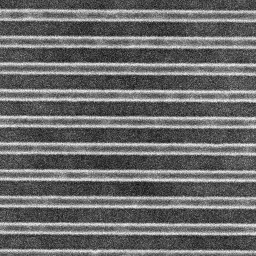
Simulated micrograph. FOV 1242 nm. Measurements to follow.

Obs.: parallel lines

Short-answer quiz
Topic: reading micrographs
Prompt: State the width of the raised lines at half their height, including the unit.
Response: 51.5 nm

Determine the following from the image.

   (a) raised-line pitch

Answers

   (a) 0.129 microns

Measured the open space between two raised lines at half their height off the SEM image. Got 79.4 nanometres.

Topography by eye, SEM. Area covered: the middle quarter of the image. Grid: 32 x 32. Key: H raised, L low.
HHHHHHHHHHHHHHHHHHHHHHHHHHHHHHHH
HHHHHHHHHHHHHHHHHHHHHHHHHHHHHHHH
LLLLLLLLLLLLLLLLLLLLLLLLLLLLLLLL
LLLLLLLLLLLLLLLLLLLLLLLLLLLLLLLL
LLLLLLLLLLLLLLLLLLLLLLLLLLLLLLLL
LLLLLLLLLLLLLLLLLLLLLLLLLLLLLLLL
LLLLLLLLLLLLLLLLLLLLLLLLLLLLLLLL
HHHHHHHHHHHHHHHHHHHHHHHHHHHHHHHH
HHHHHHHHHHHHHHHHHHHHHHHHHHHHHHHH
LLLLLLLLLLLLLLLLLLLLLLLLLLLLLLLL
LLLLLLLLLLLLLLLLLLLLLLLLLLLLLLLL
LLLLLLLLLLLLLLLLLLLLLLLLLLLLLLLL
LLLLLLLLLLLLLLLLLLLLLLLLLLLLLLLL
HHHHHHHHHHHHHHLHHHHLLLLHLHLLLLLL
HHHHHHHHHHHHHHHHHHHHHHHHHHHHHHHH
HHHHHHHHHHHHHHHHHHHHHHHHHHHHHHHH
LLLLLLLLLLLLLLLLLLLLLLLLLLLLLLLL
LLLLLLLLLLLLLLLLLLLLLLLLLLLLLLLL
LLLLLLLLLLLLLLLLLLLLLLLLLLLLLLLL
LLLLLLLLLLLLLLLLLLLLLLLLLLLLLLLL
HHHHHHHHHHHHHHHHHHHHHHHHHHHHHHHH
HHHHHHHHHHHHHHHHHHHHHHHHHHHHHHHH
LLLLLLLLLLLLLLLLLLLLLLLLLLLHHHHH
LLLLLLLLLLLLLLLLLLLLLLLLLLLLLLLL
LLLLLLLLLLLLLLLLLLLLLLLLLLLLLLLL
LLLLLLLLLLLLLLLLLLLLLLLLLLLLLLLL
LLLLLLLLLLLLLLLLLLLLLLLLLLLLLLLL
HHHHHHHHHHHHHHHHHHHHHHHHHHHHHHHH
HHHHHHHHHHHHHHHHHHHHHHHHHHHHHHHH
LLLLLLLLLLLLLLLLLLLLLLLLLLLLLLLL
LLLLLLLLLLLLLLLLLLLLLLLLLLLLLLLL
LLLLLLLLLLLLLLLLLLLLLLLLLLLLLLLL